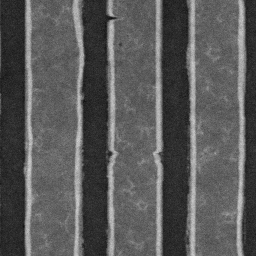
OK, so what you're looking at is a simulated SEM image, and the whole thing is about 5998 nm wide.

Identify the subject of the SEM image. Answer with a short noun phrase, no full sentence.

one or a few lines or trenches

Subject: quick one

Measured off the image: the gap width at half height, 808 nm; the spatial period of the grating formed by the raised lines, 1910 nm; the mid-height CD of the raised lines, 1.12 micrometres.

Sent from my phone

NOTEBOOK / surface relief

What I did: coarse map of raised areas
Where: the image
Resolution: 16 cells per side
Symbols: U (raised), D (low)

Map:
DDUUUDDUUUDDUUUD
DDUUUDDUUUDDUUUD
DDUUUDDUUUDDUUUD
DDUUUDDUUUDDUUUD
DDUUUDDUUUDDUUUD
DDUUUDDUUUDDUUUD
DDUUUDDUUUDDUUUD
DDUUUDDUUUDDUUUD
DDUUUDDUUUDDUUUD
DDUUUDDUUUDDUUUD
DDUUUDDUUUDDUUUD
DDUUUDDUUUDDUUUD
DDUUUDDUUUDDUUUD
DDUUUDDUUUDDUUUD
DDUUUDDUUUDDUUUD
DDUUUDDUUUDDUUUD